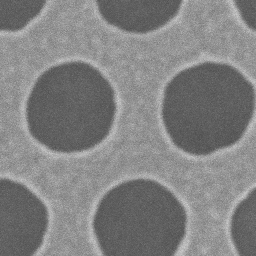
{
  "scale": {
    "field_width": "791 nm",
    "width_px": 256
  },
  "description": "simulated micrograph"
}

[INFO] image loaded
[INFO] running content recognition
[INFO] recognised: holes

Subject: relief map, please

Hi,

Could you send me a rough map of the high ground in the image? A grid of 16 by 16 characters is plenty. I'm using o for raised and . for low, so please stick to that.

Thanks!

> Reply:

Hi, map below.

...ooo.....oooo.
..ooooo...ooooo.
oooooooooooooooo
oooooooooooooooo
ooo...ooooo....o
oo.....ooo......
oo.....ooo......
oo.....ooo......
oo.....oooo....o
oooo.ooooooo.ooo
oooooooooooooooo
.oooooo...oooooo
...ooo.....oooo.
...ooo......oo..
...ooo......oo..
..oooo.....oooo.